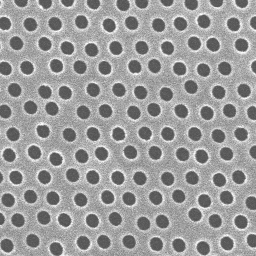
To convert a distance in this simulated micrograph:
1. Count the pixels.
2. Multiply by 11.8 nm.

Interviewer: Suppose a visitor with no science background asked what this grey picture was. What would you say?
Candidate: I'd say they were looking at a regular array of holes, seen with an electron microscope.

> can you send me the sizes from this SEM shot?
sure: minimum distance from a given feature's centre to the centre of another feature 255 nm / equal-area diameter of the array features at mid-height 0.16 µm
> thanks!